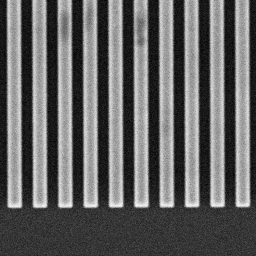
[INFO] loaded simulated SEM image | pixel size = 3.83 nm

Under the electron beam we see groups of lines, slits or small figures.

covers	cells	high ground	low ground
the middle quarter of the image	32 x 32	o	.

oo...ooo...ooo....ooo...ooo...oo
oo...ooo...ooo....ooo...ooo...oo
oo...ooo...ooo....ooo...ooo...oo
oo...ooo...ooo....ooo...ooo...oo
oo...ooo...ooo....ooo...ooo...oo
oo...ooo...ooo....ooo...ooo...oo
oo...ooo...ooo....ooo...ooo...oo
oo...ooo...ooo....ooo...ooo...oo
oo...ooo...ooo....ooo...ooo...oo
oo...ooo...ooo....ooo...ooo...oo
oo...ooo...ooo....ooo...ooo...oo
oo...ooo...ooo....ooo...ooo...oo
oo...ooo...ooo....ooo...ooo...oo
oo...ooo...ooo....ooo...ooo...oo
oo...ooo...ooo....ooo...ooo...oo
oo...ooo...ooo....ooo...ooo...oo
oo...ooo...ooo....ooo...ooo...oo
oo...ooo...ooo....ooo...ooo...oo
oo...ooo...ooo....ooo...ooo...oo
oo...ooo...ooo....ooo...ooo...oo
oo...ooo...ooo....ooo...ooo...oo
oo...ooo...ooo....ooo...ooo...oo
oo...ooo...ooo....ooo...ooo...oo
oo...ooo...ooo....ooo...ooo...oo
oo...ooo...ooo....ooo...ooo...oo
oo...ooo...ooo....ooo...ooo...oo
oo...ooo...ooo....ooo...ooo...oo
oo...ooo....ooo...ooo...ooo...oo
oo...ooo....ooo...ooo...ooo...oo
oo...ooo....ooo...ooo...ooo...oo
oo...ooo....ooo...ooo...ooo...oo
oo...ooo....ooo...ooo...ooo...oo